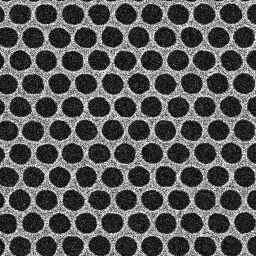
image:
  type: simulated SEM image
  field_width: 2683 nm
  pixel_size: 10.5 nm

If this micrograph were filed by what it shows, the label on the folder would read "a regular array of holes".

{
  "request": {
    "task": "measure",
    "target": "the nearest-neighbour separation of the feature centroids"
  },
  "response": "274 nm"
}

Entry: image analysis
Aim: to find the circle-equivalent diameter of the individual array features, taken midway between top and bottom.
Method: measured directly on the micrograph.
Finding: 226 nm